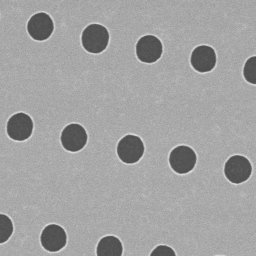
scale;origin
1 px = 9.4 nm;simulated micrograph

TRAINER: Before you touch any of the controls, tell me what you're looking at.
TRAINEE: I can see a regular array of holes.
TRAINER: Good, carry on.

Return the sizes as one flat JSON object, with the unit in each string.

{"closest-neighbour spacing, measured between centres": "518 nm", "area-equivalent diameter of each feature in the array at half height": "262 nanometers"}